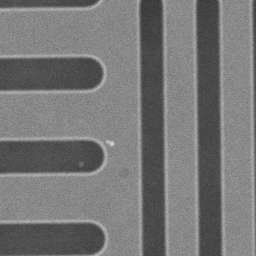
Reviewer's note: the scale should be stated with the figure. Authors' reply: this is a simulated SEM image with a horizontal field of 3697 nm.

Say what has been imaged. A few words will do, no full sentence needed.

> groups of lines, slits or small figures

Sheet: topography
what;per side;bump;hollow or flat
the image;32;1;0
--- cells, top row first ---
00000000000011111000111110011110
11111111111111111000111100001110
11111111111111111000011100001110
11111111111111111000011100001110
11111111111111111000011100001110
11111111111111111000011100001110
11111111111111111000011100001110
00000000000011111000011100001110
00000000000001111000011110001110
00000000000001111000011110001111
00000000000001111000011110001111
00111111111111111000011110001111
11111111111111111000011110001111
11111111111111111000011110001111
11111111111111111000011110001111
11111111111111111000011110001111
11111111111111111100011110001111
00000000000111111100011110001111
00000000000001111100011110001111
00000000000001111100011110001111
00000000000001111100011110001111
00000000000011111100011110001111
11111111111111111100011110001111
11111111111111111100011110001111
11111111111111111100011110001111
11111111111111111100011110001111
11111111111111111100011110001111
11111111111111111100011110001111
00000000000001111100011110001111
00000000000001111100011110001111
00000000000001111100011110001111
00000000000011111100011110001111